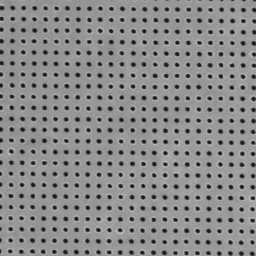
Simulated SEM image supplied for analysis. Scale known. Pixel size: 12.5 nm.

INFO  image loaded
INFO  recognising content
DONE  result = a regular array of holes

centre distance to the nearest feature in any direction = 0.131 um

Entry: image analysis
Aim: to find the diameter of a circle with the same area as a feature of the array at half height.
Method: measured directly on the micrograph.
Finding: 56.4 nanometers